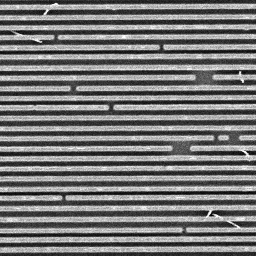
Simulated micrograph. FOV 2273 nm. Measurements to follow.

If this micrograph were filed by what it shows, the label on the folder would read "parallel lines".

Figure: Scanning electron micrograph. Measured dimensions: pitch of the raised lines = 10.1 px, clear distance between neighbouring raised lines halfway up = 38.8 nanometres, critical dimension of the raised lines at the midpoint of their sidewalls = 46.6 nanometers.